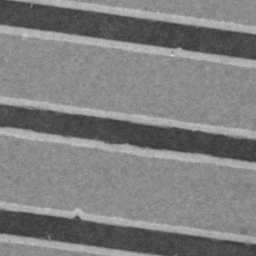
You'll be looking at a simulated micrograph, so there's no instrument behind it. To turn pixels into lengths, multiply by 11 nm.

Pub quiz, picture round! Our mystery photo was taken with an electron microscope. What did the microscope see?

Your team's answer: one or a few lines or trenches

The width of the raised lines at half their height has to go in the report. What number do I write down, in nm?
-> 778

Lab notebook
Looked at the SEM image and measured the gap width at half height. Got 0.357 micrometres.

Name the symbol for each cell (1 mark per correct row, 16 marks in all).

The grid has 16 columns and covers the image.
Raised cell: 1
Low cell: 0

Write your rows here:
0000001111111111
0000000000000111
1111100000000000
1111111111110000
1111111111111111
1111111111111111
0011111111111111
0000000001111111
1100000000000000
1111111110000000
1111111111111111
1111111111111111
1111111111111111
0000011111111111
0000000000001111
1111100000000000